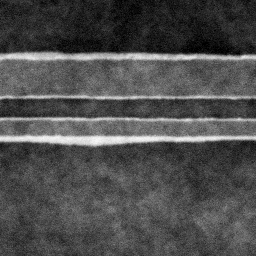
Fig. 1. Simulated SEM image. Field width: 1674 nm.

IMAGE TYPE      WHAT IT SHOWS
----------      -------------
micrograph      lines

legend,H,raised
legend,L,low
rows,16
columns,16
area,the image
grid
LLLLLLLLLLLLLLLL
LLLLLLLLLLLLLLLL
LLLLLLLLLLLLLLLL
LLLLLLLLHLLLLLLL
HHHHHHHHHHHHHHHH
HHHHHHHHHHHHHHHH
HHHHHHHHHHHHHHHH
HHHHHHHHHHHHHHHH
HHHHHHHHHHHHHHHH
LLLLLLLLLLLLLLLL
LLLLLLLLLLLLLLLL
LLLLLLLLLLLLLLLL
LLLLLLLLLLLLLLLL
LLLLLLLLLLLLLLLL
LLLLLLLLLLLLLLLL
LLLLLLLLLLLLLLLL